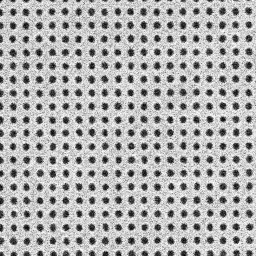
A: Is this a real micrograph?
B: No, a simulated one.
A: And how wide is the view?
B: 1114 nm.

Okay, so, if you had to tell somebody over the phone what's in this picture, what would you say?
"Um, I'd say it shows a regular array of holes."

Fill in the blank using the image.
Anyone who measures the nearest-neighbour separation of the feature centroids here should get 0.056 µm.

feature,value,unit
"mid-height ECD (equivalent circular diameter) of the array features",0.0322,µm